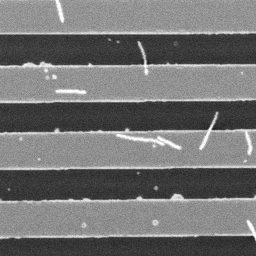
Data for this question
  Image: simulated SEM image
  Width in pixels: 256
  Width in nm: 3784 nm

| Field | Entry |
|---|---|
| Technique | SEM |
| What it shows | lines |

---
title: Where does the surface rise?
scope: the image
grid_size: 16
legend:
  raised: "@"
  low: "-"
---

@@@@@@@@@@@@@@@@
@@@@@@@@@@@@@@@@
----------------
----------------
@@@@@@@@@@@@@@@@
@@@@@@@@@@@@@@@@
----------------
----------------
@@@@@@@@@@@@@@@@
@@@@@@@@@@@@@@@@
@@@@@@@@@@@-----
----------------
--------@@@@@@@@
@@@@@@@@@@@@@@@@
@@@@@@@@@@@@@@@@
----------------